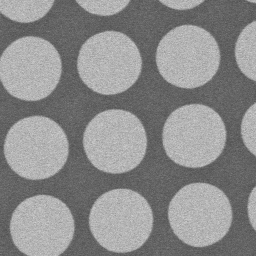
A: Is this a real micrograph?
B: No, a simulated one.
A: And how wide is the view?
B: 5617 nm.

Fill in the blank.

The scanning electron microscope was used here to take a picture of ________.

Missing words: an array of small figures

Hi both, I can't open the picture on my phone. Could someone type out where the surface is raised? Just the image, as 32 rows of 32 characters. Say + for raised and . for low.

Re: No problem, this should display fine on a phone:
+++++++...++++++....+++++.......
++++++.....++++.................
..+++...........................
......................+++......+
............++++.....+++++....++
.+++++....+++++++...+++++++...++
+++++++...+++++++...+++++++..+++
++++++++..++++++++..+++++++...++
++++++++..++++++++..+++++++...++
+++++++...+++++++...+++++++....+
+++++++....++++++....+++++......
.+++++......+++.................
...++...........................
.......................+++.....+
............+++++....++++++....+
..+++++....+++++++...+++++++..++
.+++++++...+++++++..++++++++..++
.+++++++..++++++++..++++++++..++
.++++++++..+++++++...+++++++...+
.+++++++...+++++++...++++++.....
.+++++++....+++++.....++++......
..+++++......+++................
................................
.......................++++.....
....++.......+++++....++++++...+
...+++++....+++++++..++++++++..+
..+++++++..++++++++..++++++++..+
.++++++++..++++++++..++++++++..+
.++++++++..++++++++..++++++++...
.++++++++...+++++++...++++++....
..+++++++....+++++.....+++......
...+++++......++................